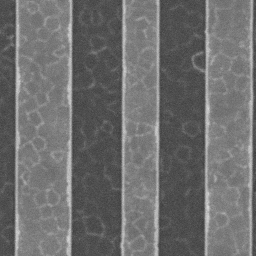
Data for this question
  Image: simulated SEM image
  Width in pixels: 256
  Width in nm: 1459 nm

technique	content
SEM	one or a few lines or trenches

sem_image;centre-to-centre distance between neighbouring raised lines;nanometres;527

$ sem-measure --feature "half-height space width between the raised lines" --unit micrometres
0.29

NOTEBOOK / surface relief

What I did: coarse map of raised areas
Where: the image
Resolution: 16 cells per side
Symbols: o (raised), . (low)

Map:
.ooo....oo...ooo
.ooo....oo...ooo
.ooo....oo...ooo
.ooo....oo...ooo
.ooo....oo...ooo
.ooo....oo...ooo
.ooo....oo...ooo
.ooo....oo...ooo
.ooo....oo...ooo
.ooo....oo...ooo
.ooo....oo...ooo
.ooo....oo...ooo
.ooo....oo...ooo
.ooo....oo...ooo
.ooo....oo...ooo
.ooo....oo...ooo